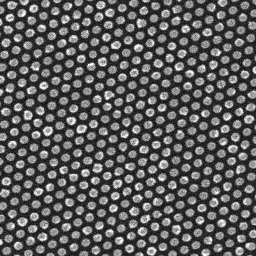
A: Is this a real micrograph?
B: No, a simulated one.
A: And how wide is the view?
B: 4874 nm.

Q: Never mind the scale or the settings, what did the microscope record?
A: a regular array of raised bodies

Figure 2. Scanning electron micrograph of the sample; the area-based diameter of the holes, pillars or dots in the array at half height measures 150 nm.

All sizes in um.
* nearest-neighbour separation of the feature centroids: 0.233